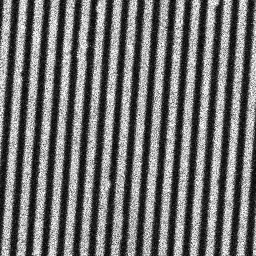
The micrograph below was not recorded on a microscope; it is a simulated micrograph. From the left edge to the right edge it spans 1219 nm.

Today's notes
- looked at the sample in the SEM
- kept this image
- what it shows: parallel lines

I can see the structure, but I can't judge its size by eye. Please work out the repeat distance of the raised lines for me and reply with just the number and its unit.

0.0746 um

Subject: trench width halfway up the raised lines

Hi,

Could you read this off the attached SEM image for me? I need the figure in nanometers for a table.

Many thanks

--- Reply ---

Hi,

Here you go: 32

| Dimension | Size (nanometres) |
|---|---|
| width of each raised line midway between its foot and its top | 41.5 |